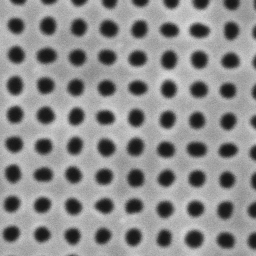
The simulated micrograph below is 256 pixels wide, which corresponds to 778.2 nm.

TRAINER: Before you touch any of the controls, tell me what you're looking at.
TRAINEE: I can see a regular array of holes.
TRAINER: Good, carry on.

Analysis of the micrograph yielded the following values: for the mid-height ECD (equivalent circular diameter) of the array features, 0.0531 microns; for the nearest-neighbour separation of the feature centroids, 89 nanometers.